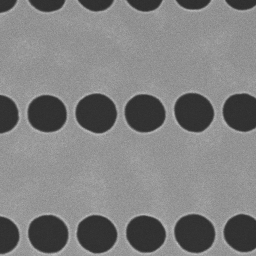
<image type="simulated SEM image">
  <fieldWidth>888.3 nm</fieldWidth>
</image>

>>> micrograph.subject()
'a regular array of holes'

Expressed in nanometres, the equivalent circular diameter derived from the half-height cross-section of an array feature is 136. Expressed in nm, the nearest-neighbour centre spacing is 169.